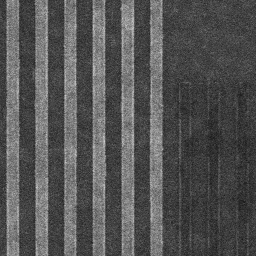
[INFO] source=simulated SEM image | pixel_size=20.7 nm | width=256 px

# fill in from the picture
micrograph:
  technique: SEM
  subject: parallel lines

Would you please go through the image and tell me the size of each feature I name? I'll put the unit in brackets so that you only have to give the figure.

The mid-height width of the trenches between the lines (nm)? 360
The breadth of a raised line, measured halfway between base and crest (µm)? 0.222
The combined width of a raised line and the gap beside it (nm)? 593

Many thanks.